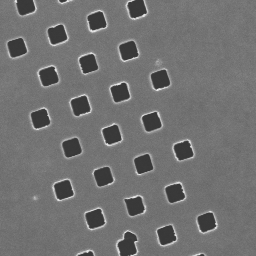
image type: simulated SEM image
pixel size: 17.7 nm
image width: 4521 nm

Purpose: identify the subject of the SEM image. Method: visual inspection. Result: a regular array of holes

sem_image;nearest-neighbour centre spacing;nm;739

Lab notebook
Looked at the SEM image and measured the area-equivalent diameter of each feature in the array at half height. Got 0.326 um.